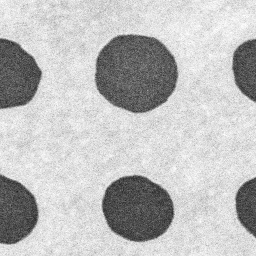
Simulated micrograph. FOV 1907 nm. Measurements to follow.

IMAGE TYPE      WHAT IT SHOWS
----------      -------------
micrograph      holes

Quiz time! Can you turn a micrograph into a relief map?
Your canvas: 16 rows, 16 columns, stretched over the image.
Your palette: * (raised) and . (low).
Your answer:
****************
****************
.******...******
..****.....****.
...***.....****.
..****.....****.
..*****...******
****************
****************
****************
****************
.******...*****.
..****.....****.
..*****....****.
..*****...******
****************